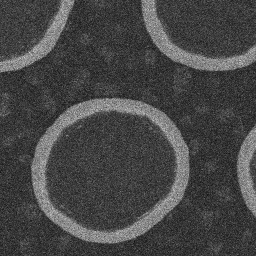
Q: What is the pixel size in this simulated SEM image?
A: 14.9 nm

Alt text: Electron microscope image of raised bodies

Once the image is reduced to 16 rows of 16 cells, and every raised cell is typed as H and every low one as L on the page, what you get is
HHHHLLLLLHHHHHHH
HHHHLLLLLLHHHHHH
HHHLLLLLLLHHHHHH
HHLLLLLLLLLHHHHH
LLLLLLLLLLLLLLLL
LLLLLLLLLLLLLLLL
LLLLLLLLLLLLLLLL
LLLLHHHHHHLLLLLL
LLLHHHHHHHHLLLLL
LLLHHHHHHHHLLLLH
LLHHHHHHHHHLLLLH
LLHHHHHHHHHLLLLH
LLLHHHHHHHHLLLLL
LLLHHHHHHHLLLLLL
LLLLLHHHLLLLLLLL
LLLLLLLLLLLLLLLL